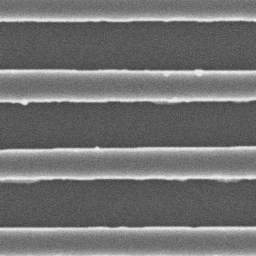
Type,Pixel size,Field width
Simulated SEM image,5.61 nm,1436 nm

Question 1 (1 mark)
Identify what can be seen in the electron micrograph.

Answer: lines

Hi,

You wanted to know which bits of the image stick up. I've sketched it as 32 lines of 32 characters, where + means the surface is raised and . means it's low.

++++++++++++++++++++++++++++++++
++++++++++++++++++++++++++++++++
++++++++++++++++++++++++++++++++
................................
................................
................................
................................
................................
................................
++++++++++++++++++++++++++++++++
++++++++++++++++++++++++++++++++
++++++++++++++++++++++++++++++++
++++++++++++++++++++++++++++++++
................................
................................
................................
................................
................................
............+.....++++++++++++++
++++++++++++++++++++++++++++++++
++++++++++++++++++++++++++++++++
++++++++++++++++++++++++++++++++
+...............................
................................
................................
................................
................................
................................
...............+..++++++.+++++++
++++++++++++++++++++++++++++++++
++++++++++++++++++++++++++++++++
++++++++++++++++++++++++++++++++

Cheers